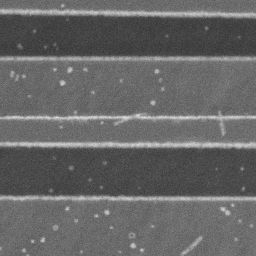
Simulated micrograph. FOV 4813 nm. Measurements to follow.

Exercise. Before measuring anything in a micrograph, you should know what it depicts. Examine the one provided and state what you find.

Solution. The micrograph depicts lines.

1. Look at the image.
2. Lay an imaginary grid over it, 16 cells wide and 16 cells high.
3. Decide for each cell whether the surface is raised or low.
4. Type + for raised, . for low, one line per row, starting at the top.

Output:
++++++++++++++++
................
................
................
++++++++++++++++
++++++++++++++++
++++++++++++++++
++++++++++++++++
++++++++++++++++
................
................
................
++++++++++++++++
++++++++++++++++
++++++++++++++++
++++++++++++++++